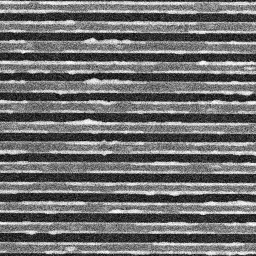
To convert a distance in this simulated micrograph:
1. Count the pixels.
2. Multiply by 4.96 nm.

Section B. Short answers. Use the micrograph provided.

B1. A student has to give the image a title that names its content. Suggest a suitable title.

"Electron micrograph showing parallel lines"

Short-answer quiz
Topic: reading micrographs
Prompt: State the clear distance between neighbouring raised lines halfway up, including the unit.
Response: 8.63 pixels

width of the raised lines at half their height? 11.4 px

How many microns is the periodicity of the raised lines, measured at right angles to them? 0.0996